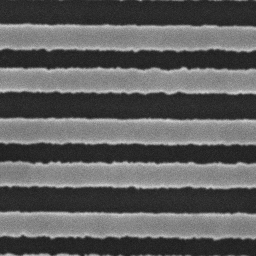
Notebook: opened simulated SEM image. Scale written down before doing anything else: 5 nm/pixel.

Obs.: lines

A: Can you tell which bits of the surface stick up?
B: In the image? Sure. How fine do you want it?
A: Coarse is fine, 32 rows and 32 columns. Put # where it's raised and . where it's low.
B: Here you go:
................................
................................
................................
################################
################################
################################
................................
................................
................................
################################
################################
#...##.#########################
................................
................................
................................
################################
################################
################################
................................
................................
#########################.##.###
################################
################################
..................##......###...
................................
................................
.#..............................
################################
################################
################################
................................
................................